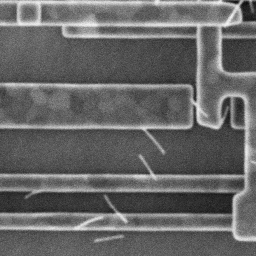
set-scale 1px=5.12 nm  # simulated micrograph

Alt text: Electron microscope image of wiring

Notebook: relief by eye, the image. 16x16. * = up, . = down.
***************.
***************.
............**..
............**..
............**..
............****
............**.*
............**.*
...............*
...............*
...............*
...............*
...............*
...............*
...............*
................